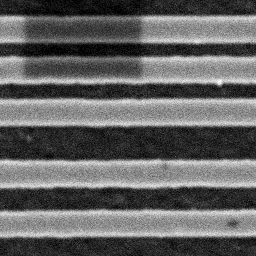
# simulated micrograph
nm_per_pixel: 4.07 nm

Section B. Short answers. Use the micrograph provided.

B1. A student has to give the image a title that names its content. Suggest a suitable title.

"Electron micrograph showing lines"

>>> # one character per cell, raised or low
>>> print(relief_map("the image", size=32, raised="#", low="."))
................................
................................
################################
################################
################################
................................
................................
################################
################################
################################
................................
................................
###########....#################
################################
################################
################################
................................
................................
................................
................................
################################
################################
################################
................................
................................
................................
#.##############################
################################
################################
##########.........##...........
................................
................................